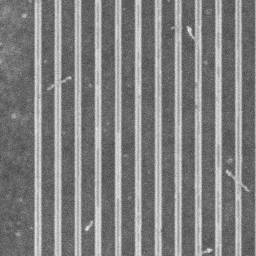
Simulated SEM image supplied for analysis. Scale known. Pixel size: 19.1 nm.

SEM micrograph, parallel lines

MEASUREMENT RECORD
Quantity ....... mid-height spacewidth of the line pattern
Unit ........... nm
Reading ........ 299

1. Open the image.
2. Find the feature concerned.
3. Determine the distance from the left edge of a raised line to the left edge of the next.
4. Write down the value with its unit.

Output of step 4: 383 nanometres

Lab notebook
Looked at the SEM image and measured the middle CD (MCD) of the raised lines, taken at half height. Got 81.2 nm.